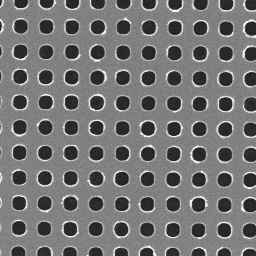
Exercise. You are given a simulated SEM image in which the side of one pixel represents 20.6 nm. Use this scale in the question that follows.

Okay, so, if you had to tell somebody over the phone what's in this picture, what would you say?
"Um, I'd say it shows a regular array of holes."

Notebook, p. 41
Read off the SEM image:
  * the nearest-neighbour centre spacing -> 0.516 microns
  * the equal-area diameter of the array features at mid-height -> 298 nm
